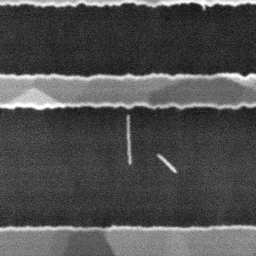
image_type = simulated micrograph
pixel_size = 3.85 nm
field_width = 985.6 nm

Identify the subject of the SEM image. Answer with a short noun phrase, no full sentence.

lines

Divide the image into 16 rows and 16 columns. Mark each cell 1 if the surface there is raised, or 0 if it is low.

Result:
0000000000000000
0000000000000000
0000000000000000
0000000000000000
0000000000000000
1111111111111111
1111111111111111
0000000000000000
0000000000000000
0000000000000000
0000000000000000
0000000000000000
0000000000000000
0000000000000000
1111111111111111
1111111111111111